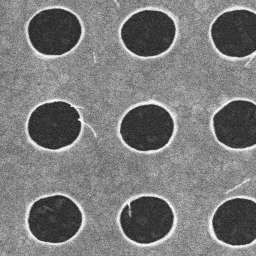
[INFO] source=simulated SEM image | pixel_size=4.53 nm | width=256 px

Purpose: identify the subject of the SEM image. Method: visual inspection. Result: holes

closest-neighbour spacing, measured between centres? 420 nanometers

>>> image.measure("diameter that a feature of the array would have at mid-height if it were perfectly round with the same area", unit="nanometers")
235